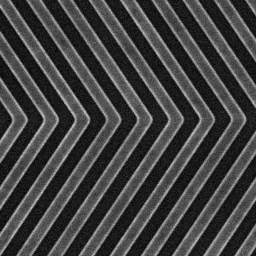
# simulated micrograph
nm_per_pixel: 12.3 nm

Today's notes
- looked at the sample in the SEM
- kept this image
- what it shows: groups of lines, slits or small figures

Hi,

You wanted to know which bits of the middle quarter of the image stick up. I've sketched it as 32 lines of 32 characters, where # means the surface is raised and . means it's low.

..####....###....####....####...
..####....####....####....####..
...####....####....####....###..
....###.....###....####....####.
.....###....####....####....####
#....####....####....###.....###
##....###.....###.....###....###
##.....###.....###....####....##
###....####....####....####....#
####....####....###....####....#
.###.....###....####....####....
.####....####....####....####...
..####....####....###....####...
...###....####....####....####..
...###....####....####....####..
..####....####....###....####...
.####....####....####....###....
.###....####....####....####....
####....####....###....####....#
###....####....####....###.....#
##.....###....####....####....##
##....####....###.....###....###
#....####....####....###.....###
.....###....####....####....###.
....###.....###....####....####.
...####....####....####....###..
...###....####....####....####..
..####....###....####....####...
.####....####....####....###....
####....####....####....####....
####....###....####....####....#
###....####....###.....###....##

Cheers